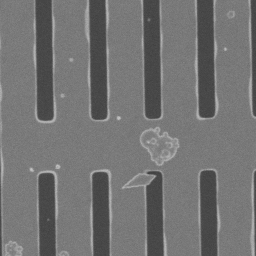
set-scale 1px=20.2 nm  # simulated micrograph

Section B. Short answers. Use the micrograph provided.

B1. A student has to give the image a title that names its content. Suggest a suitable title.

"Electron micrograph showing groups of lines, slits or small figures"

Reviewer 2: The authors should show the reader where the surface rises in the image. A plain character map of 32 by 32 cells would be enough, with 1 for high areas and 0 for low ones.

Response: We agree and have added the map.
11110001111001111100111100011110
11110001111001111100111100011110
11110001111001111100111110011110
11110001111001111100111110011110
11110001111001111100111110011110
11110001111001111100111110011110
11110001111001111100111110011110
11110001111001111100111110011110
11110001111000111100111110011110
11110001111000111100111110011110
11110001111000111100111110011110
11110001111000111100111110011110
11110001111000111100111110011110
11110001111000111100111110011110
11111001111000111100111110011111
11111111111111111111111111111111
11111111111111111111111111111111
11111111111111111111111111111111
11111111111111111111111111111111
11111111111111111111111111111111
11111111111111111111111111111111
11111111111101111110111110011111
11111001111000111110111110011111
11111001111000111100111110011111
11111001111000111100111110011111
11111001111000111100111110011111
11111001111000111100111110011111
11111001111000111100111110011111
11111001111000111100111110011111
11111001111000111100011110011111
11111001111000111100011110011111
11111001111100111100011110011111